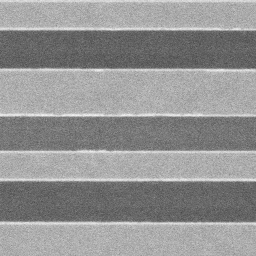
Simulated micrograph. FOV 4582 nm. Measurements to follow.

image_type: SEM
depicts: lines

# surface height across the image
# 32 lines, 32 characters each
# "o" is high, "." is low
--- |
oooooooooooooooooooooooooooooooo
oooooooooooooooooooooooooooooooo
oooooooooooooooooooooooooooooooo
oooooooooooooooooooooooooooooooo
................................
................................
................................
................................
................................
oooooooooooooooooooooooooooooooo
oooooooooooooooooooooooooooooooo
oooooooooooooooooooooooooooooooo
oooooooooooooooooooooooooooooooo
oooooooooooooooooooooooooooooooo
................................
................................
................................
................................
................................
oooooooooooooooooooooooooooooooo
oooooooooooooooooooooooooooooooo
oooooooooooooooooooooooooooooooo
...............................o
................................
................................
................................
................................
................................
oooooooooooooooooooooooooooooooo
oooooooooooooooooooooooooooooooo
oooooooooooooooooooooooooooooooo
oooooooooooooooooooooooooooooooo